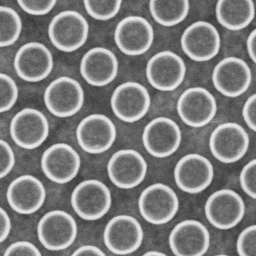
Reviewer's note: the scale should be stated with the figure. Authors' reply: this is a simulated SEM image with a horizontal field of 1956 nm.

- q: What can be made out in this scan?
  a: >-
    a regular array of raised bodies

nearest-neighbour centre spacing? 356 nanometers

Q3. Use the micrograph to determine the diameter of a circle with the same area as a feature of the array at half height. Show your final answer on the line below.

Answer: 280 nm